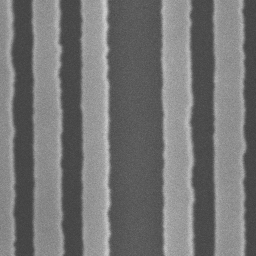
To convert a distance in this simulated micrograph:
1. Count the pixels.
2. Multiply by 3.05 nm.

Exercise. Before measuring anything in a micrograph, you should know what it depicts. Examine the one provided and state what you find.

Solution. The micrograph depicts lines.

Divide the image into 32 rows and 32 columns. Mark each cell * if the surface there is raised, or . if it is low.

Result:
*...***...***.......****...***..
**..****..***.......****...***..
**..***...***.......****...***..
**..***...***.......****...***..
**..***...***.......****...***..
*...***...***.......****...***..
*...****..***.......****...***..
*...****..***.......****...***..
**..***...***.......****...****.
**..***...***.......****...***..
**..***...****......****...***..
**..****..****......****...***..
**..****..****......****...***..
*...****..****......****...****.
**..****..****......****...****.
**..****..****......****...***..
**..****..****......****...***..
**..****..****......****...****.
**..****..****.......***...****.
**..****..****......****...***..
**..****..****.......***...***..
**..****..****......****...****.
**..****..****......****...***..
**..****..****......****...***..
**..****..****......****...****.
**..****..****.......***...***..
**..****..***.......****...***..
**..****..****......****...***..
**..****..****......****...****.
**..****..****......****...****.
**..****...***......****...****.
**..****..****.......***...****.